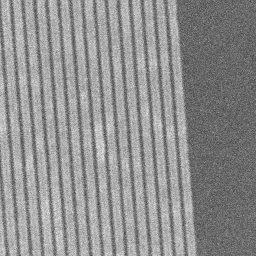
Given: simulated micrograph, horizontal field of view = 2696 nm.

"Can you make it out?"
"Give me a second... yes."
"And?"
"parallel lines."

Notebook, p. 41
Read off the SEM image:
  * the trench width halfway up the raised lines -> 57.7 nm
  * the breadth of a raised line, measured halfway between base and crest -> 68.2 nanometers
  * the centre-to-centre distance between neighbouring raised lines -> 125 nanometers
